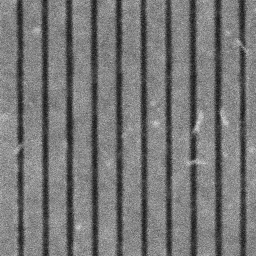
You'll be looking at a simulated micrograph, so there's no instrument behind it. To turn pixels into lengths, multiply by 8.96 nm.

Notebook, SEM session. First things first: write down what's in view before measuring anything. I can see parallel lines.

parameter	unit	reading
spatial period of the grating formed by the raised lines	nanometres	221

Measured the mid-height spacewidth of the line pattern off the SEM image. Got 59.3 nanometers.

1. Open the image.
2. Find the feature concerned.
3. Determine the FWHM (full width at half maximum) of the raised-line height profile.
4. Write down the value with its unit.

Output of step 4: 159 nanometers